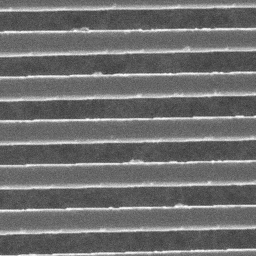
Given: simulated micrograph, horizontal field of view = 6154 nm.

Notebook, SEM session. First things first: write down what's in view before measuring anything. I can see lines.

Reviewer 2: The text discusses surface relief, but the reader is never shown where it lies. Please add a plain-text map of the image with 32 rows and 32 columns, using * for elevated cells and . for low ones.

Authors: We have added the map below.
********************************
................................
................................
................................
********************************
********************************
****************................
................................
................................
........************************
********************************
********************************
**..............................
................................
................................
********************************
********************************
************************........
................................
................................
.........***********************
********************************
********************************
................................
................................
................................
********************************
********************************
***************************.....
................................
................................
....................************